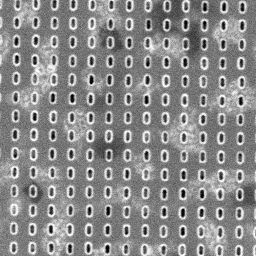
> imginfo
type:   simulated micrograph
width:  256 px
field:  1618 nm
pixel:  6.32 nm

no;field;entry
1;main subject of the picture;a regular array of holes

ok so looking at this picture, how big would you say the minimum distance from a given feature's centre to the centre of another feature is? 116 nanometers